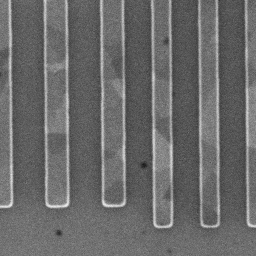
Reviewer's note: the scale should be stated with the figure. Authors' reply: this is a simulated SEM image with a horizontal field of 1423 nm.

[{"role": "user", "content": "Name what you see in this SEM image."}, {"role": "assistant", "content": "groups of lines, slits or small figures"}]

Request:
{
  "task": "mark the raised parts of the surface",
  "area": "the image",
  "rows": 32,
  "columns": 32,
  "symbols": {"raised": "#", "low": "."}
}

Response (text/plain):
#.....##.....##....##....##....#
#.....##.....##....##....##....#
#.....##.....##....##....##....#
#.....##.....##....##....##....#
#.....##.....##....##....##....#
#.....##.....##....##....##....#
#.....##.....##....##....##....#
#.....##.....##....##....##....#
#.....##.....##....##....##....#
#.....##.....##....##....##....#
#.....##.....##....##....##....#
#.....##.....##....##....##....#
#.....##.....##....##....##....#
#.....##.....##....##....##....#
#.....##.....##....##....##....#
#.....##.....##....##....##....#
#.....##.....###...##....##....#
#.....##.....###...##....##....#
#.....##.....##....##....##....#
#.....##.....##....##....##....#
#.....##.....###...##....##....#
#.....##.....###...##....##....#
#.....##.....###...##....##....#
#.....##.....###...##....##....#
#.....##.....###...##....##....#
#.....##.....##....##....##....#
...................##....##....#
...................##....##....#
................................
................................
................................
................................